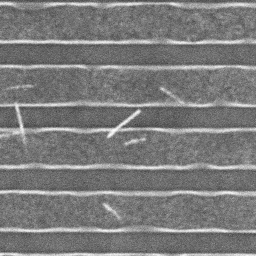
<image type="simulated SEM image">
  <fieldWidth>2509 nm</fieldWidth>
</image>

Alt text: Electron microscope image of wiring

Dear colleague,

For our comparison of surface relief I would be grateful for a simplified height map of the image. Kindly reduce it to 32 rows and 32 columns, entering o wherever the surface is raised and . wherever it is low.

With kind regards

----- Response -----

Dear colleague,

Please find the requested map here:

.................ooooo..........
oooooooooooooooooooooooooooooooo
oooooooooooooooooooooooooooooooo
oooooooooooooooooooooooooooooooo
oooooooooooooooooooooooooooooooo
................................
................................
................................
ooooooooooo.ooooo....oooooooooo.
oooooooooooooooooooooooooooooooo
oooooooooooooooooooooooooooooooo
oooooooooooooooooooooooooooooooo
oooooooooooooooooooooooooooooooo
................................
................................
................................
oooooooooooooooooooooooooooooooo
oooooooooooooooooooooooooooooooo
oooooooooooooooooooooooooooooooo
oooooooooooooooooooooooooooooooo
oooooooooooooooooooooooooooooooo
................................
................................
................................
oooooooooooooooooooooooooooooooo
oooooooooooooooooooooooooooooooo
oooooooooooooooooooooooooooooooo
oooooooooooooooooooooooooooooooo
oooooooooooooooooooooooooooooooo
................................
................................
................................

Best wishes